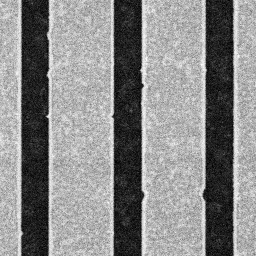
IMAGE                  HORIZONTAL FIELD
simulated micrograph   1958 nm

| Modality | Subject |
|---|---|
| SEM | one or a few lines or trenches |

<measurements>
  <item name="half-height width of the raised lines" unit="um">0.473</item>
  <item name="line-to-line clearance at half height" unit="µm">0.232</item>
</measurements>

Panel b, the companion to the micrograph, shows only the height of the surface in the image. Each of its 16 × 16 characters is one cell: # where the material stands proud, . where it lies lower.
#..####..####..#
#..####..####..#
#..####..####..#
#..####..####..#
#..####..####..#
#..####..####..#
#..####..####..#
#..####..####..#
#..####..####..#
#..####..####..#
#..####..####..#
#..####..####..#
#..####..####..#
#..####..####..#
#..####..####..#
#..####..####..#